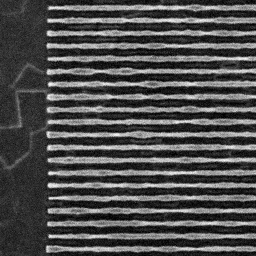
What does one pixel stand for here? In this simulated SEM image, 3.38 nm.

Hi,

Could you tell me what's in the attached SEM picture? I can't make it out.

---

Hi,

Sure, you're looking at parallel lines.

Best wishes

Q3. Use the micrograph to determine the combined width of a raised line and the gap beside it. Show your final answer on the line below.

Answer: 42.9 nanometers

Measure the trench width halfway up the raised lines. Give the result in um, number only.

0.0296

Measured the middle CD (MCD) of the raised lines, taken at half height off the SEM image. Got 13.5 nm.